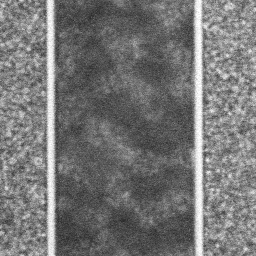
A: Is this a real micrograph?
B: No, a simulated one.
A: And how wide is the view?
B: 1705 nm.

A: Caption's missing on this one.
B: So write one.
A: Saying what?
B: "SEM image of one or a few lines or trenches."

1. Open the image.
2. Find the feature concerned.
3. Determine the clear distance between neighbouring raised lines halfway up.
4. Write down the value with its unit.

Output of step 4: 0.983 microns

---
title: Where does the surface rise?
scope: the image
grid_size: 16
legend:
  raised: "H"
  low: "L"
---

HHHLLLLLLLLLHHHH
HHHLLLLLLLLLHHHH
HHHLLLLLLLLLHHHH
HHHLLLLLLLLLHHHH
HHHLLLLLLLLLHHHH
HHHLLLLLLLLLHHHH
HHHLLLLLLLLLHHHH
HHHLLLLLLLLLHHHH
HHHLLLLLLLLLHHHH
HHHLLLLLLLLLHHHH
HHHLLLLLLLLLHHHH
HHHLLLLLLLLLHHHH
HHHLLLLLLLLLHHHH
HHHLLLLLLLLLHHHH
HHHLLLLLLLLLHHHH
HHHLLLLLLLLLHHHH